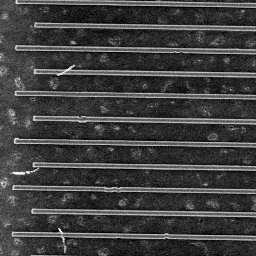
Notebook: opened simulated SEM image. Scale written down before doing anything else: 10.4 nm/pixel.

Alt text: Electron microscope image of parallel lines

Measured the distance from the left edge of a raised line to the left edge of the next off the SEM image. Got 242 nm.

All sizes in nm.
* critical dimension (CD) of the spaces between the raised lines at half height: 197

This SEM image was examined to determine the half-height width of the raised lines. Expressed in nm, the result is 49.5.